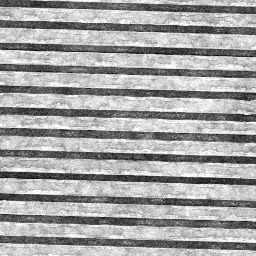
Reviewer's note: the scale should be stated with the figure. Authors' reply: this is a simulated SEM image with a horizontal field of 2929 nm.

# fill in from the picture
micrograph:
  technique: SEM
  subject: parallel lines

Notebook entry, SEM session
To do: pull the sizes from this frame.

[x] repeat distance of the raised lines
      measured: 246 nm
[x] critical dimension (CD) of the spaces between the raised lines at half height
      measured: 0.0943 microns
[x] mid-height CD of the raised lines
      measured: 0.157 µm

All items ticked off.